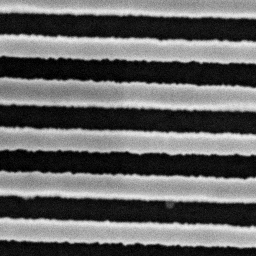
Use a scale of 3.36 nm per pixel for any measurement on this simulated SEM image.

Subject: lines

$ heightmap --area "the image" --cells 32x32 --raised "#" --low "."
################################
...#############################
................................
................................
#####...........................
################################
################################
...............#################
................................
................................
######################..........
################################
################################
....................############
................................
................................
####################.#..........
################################
################################
................................
................................
#...#...........................
################################
################################
..##.###########################
................................
................................
#######.........................
################################
################################
..................#.############
................................